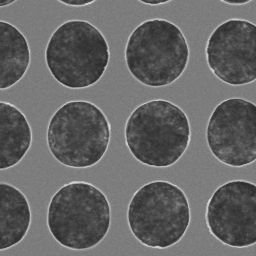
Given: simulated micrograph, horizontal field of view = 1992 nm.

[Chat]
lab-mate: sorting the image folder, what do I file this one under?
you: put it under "holes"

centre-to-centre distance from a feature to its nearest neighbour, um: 0.622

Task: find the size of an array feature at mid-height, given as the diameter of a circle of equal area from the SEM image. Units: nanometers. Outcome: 494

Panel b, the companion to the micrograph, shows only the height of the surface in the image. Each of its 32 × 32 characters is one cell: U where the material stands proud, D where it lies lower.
DUUUUUUUUDUUUUUUUUUUUUUUUUUUUUUU
UUUUUUUUUUUUUUUUUUUUUUUUUUUUUUUU
UUUUUUUUUUUUUUUUUUUUUUUUUUUUUUUU
DDUUUUUDDDDDUUUUUDDDDDUUUUUDDDDD
DDDUUUUDDDDDDUUUDDDDDDDUUUDDDDDD
DDDUUUDDDDDDDUUUDDDDDDDUUUDDDDDD
DDDDUUDDDDDDDUUUDDDDDDDUUUDDDDDD
DDDDUUDDDDDDDUUUDDDDDDDUUUDDDDDD
DDDUUUDDDDDDDUUUDDDDDDDUUUDDDDDD
DDDUUUUDDDDDDUUUUDDDDDUUUUUDDDDD
DDUUUUUUDDDUUUUUUUDDDUUUUUUUUDUU
UUUUUUUUUUUUUUUUUUUUUUUUUUUUUUUU
UUUUUUUUUUUUUUUUUUUUUUUUUUUUDDUU
DDUUUUUUDDDDUUUUUDDDDDUUUUUDDDDD
DDDUUUUDDDDDDUUUDDDDDDDUUUDDDDDD
DDDUUUDDDDDDDUUUDDDDDDDUUUDDDDDD
DDDDUUDDDDDDDDUUDDDDDDDDUUDDDDDD
DDDDUUDDDDDDDDUUDDDDDDDUUUDDDDDD
DDDUUUDDDDDDDUUUDDDDDDDUUUDDDDDD
DDDUUUUDDDDDDUUUUDDDDDUUUUUDDDDD
DDUUUUUUDDDUUUUUUUDDDUUUUUUUUDDU
UUUUUUUUUUUUUUUUUUUUUUUUUUUUUUUU
UUUUUUUUUUUUUUUUUUUUUUUUUUUUUUUU
DDUUUUUUDDDDUUUUUUDDDDUUUUUDDDDD
DDDUUUUDDDDDDUUUUDDDDDDUUUUDDDDD
DDDUUUDDDDDDDUUUDDDDDDDUUUDDDDDD
DDDDUUDDDDDDDDUUDDDDDDDDUUDDDDDD
DDDDUUDDDDDDDDUUDDDDDDDDUUDDDDDD
DDDUUUDDDDDDDDUUDDDDDDDUUUDDDDDD
DDDUUUUDDDDDDUUUUDDDDDDUUUUDDDDD
DDUUUUUUDDDDUUUUUUDDDDUUUUUUUDDU
UUUUUUUUUUUUUUUUUUUUUUUUUUUUUUUU